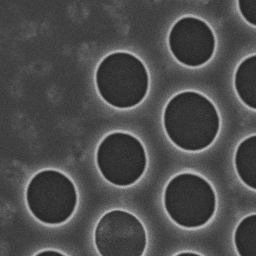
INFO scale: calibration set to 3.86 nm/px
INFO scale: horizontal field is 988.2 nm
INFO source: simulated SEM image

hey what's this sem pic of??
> holes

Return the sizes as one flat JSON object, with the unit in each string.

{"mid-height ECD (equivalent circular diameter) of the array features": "53.4 pixels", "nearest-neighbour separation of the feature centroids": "306 nanometres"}